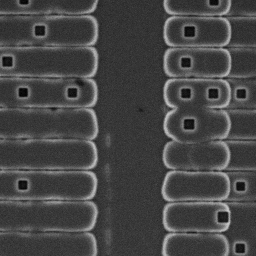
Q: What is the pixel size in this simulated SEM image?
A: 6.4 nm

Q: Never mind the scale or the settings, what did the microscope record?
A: wiring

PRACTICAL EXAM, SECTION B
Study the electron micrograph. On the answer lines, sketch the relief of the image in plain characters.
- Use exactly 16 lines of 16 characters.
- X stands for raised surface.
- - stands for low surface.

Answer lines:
XXXXXX----XXXX--
XXXXXX----XXXX--
XXXXXX----XXXX--
XXXXXX----XXXX--
XXXXXX----XXXX--
XXXXXX----XXXX--
XXXXXX-----XXX--
XXXXXX----XXXX--
XXXXXX-----XXX--
XXXXXX----XXXX--
XXXXXX-----XXX--
XXXXXX----XXXX--
XXXXXX----XXXX--
XXXXXX----XXXX--
XXXXXX----XXXX--
XXXXXX----XXXX--